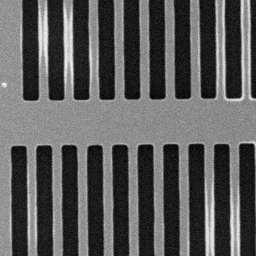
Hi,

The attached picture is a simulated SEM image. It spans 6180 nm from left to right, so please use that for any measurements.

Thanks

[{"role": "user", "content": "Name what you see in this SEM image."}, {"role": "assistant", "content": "groups of lines, slits or small figures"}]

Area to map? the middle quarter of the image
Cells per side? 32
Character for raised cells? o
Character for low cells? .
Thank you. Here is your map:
.o.....o.....oo....oo.....o.....
.o.....o.....oo....oo.....o.....
oo.....o.....oo....oo.....o.....
oo.....o.....oo....oo.....o.....
oo.....o.....oo....oo.....o.....
oo.....oo....oo....oo.....o.....
oo.....oo....oo....oo.....oo....
oo.....oo....oo....oo.....oo....
oo....ooo....oo....oo....ooo....
oooooooooooooooooooooooooooooooo
oooooooooooooooooooooooooooooooo
oooooooooooooooooooooooooooooooo
oooooooooooooooooooooooooooooooo
oooooooooooooooooooooooooooooooo
oooooooooooooooooooooooooooooooo
oooooooooooooooooooooooooooooooo
oooooooooooooooooooooooooooooooo
oooooooooooooooooooooooooooooooo
oooooooooooooooooooooooooooooooo
oooooooooooooooooooooooooooooooo
...ooo....oo....ooo...ooo....oo.
....oo....oo....oo....ooo....oo.
....oo....oo....oo....ooo....oo.
....oo....oo....oo....ooo....oo.
....oo....oo....oo....ooo....oo.
....oo....oo....oo....ooo....oo.
....oo....oo....oo.....oo....oo.
....oo....oo....oo.....oo....oo.
....oo....oo....oo.....oo....oo.
....oo....oo....oo.....oo....oo.
....oo....oo....oo.....oo....oo.
....oo....oo....oo.....oo....oo.